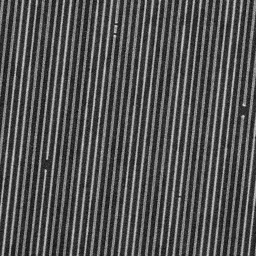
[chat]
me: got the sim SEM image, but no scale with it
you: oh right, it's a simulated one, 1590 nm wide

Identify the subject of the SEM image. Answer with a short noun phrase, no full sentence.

parallel lines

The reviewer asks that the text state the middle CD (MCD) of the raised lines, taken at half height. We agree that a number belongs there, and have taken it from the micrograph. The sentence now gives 13.9 nanometres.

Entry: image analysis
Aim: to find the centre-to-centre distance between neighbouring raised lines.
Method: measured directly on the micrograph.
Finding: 42.2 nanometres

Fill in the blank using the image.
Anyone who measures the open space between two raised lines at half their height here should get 28.6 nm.